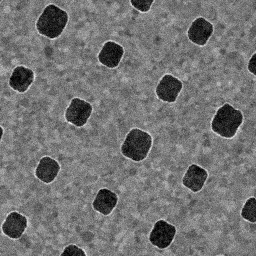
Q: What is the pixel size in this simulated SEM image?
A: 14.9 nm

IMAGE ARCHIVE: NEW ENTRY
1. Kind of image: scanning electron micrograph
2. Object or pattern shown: a regular array of holes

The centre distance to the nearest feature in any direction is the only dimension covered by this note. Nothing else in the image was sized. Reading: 965 nanometers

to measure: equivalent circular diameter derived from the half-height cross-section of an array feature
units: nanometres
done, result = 385